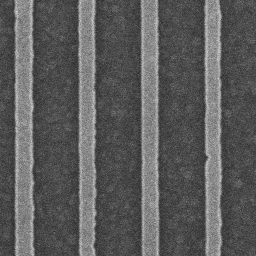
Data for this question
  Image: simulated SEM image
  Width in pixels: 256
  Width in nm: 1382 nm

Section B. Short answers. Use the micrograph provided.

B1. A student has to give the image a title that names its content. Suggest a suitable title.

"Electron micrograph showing one or a few lines or trenches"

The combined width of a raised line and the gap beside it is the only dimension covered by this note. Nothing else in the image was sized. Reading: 0.34 microns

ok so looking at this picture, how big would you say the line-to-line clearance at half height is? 263 nanometers